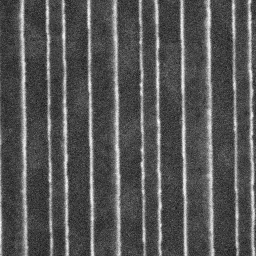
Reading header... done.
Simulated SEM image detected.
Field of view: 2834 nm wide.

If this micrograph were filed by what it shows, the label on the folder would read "lines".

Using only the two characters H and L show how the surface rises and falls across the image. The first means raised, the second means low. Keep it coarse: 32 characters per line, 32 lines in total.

HHHLLLHHLLLHHHLLLLHHLLLHHHLLLHHL
HHHLLLHHLLLHHHLLLLHHLLLHHHLLLHHL
HHHLLLHHLLLHHHLLLLHHLLLHHHLLLHHL
HHHLLLHHLLLHHHLLLLHHLLLHHHLLLHHL
HHHLLLHHLLLHHHLLLLHHLLLHHHLLLHHL
HHHLLLHHLLLHHHLLLLHHLLLHHHLLLHHL
HHHLLLHHLLLHHHLLLLHHLLLHHHLLLHHL
HHHLLLHHLLLHHHLLLLHHLLLHHHLLLHHL
HHHLLLHHLLLHHHLLLLHHLLLHHHLLLHHL
HHHLLLHHLLLHHHLLLLHHLLLHHHLLLHHL
HHHLLLHHLLLHHHHLLLHHLLLHHHLLLHHL
HHHLLLHHLLLHHHHLLLHHLLLHHHLLLHHL
HHHLLLHHLLLHHHHLLLHHLLLHHHLLLHHL
HHHLLLHHLLLHHHHLLLHHLLLHHHLLLHHL
HHHLLLHHLLLHHHHLLLHHLLLHHHLLLHHH
HHHLLLHHLLLHHHHLLLHHLLLHHHLLLHHL
HHHLLLHHLLLHHHHLLLHHLLLHHHLLLHHL
HHHLLLHHLLLHHHHLLLHHLLLHHHLLLHHH
HHHLLLHHLLLHHHHLLLHHLLLHHHLLLHHH
HHHLLLHHLLLHHHHLLLHHLLLHHHLLLHHH
HHHLLLHHLLLHHHHLLLHHLLLHHHLLLHHH
HHHLLLHHLLLHHHHLLLHHLLLHHHLLLHHH
HHHLLLHHLLLHHHHLLLHHLLLHHHLLLHHH
HHHLLLHHLLLHHHHLLLHHLLLHHHLLLHHH
HHHLLLHHLLLHHHHLLLHHLLLHHHLLLLHH
HHHLLLHHLLLHHHHLLLHHLLLHHHLLLLHH
HHHLLLHHLLLHHHHLLLHHLLLHHHLLLLHH
HHHLLLHHLLLHHHHLLLHHLLLHHHLLLLHH
HHHLLLHHLLLHHHHLLLHHLLLHHHLLLLHH
HHHLLLHHLLLHHHHLLLHHLLLHHHLLLLHH
HHHLLLHHLLLHHHHLLLHHLLLHHHHLLLHH
HHHLLLHHLLLHHHHLLLHHLLLHHHHLLLHH